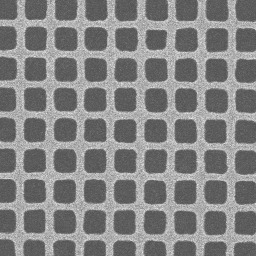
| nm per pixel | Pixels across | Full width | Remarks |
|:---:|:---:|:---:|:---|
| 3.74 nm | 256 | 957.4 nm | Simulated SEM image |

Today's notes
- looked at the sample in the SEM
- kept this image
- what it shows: a regular array of holes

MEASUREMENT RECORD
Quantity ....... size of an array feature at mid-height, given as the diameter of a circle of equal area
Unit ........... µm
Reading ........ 0.0917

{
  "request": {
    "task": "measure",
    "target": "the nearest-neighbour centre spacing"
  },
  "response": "0.111 micrometres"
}